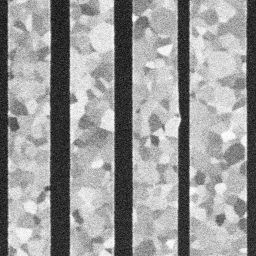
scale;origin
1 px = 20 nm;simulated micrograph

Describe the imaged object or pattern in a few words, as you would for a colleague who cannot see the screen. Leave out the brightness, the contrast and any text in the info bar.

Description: one or a few lines or trenches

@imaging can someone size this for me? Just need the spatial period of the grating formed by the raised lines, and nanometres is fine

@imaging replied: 1260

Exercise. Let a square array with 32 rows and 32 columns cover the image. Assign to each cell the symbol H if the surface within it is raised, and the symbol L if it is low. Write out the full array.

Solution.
LHHHHHLLLHHHHHLLLHHHHHLLHHHHHHHL
LHHHHHLLLHHHHHLLLHHHHHLLHHHHHHHL
LHHHHHLLLHHHHHLLLHHHHHLLHHHHHHHL
LHHHHHLLLHHHHHLLLHHHHHLLHHHHHHHL
LHHHHHLLLHHHHHLLLHHHHHLLHHHHHHHL
LHHHHHLLLHHHHHLLLHHHHHLLHHHHHHHL
LHHHHHLLLHHHHHLLLHHHHHLLHHHHHHHL
LHHHHHLLLHHHHHLLLHHHHHLLHHHHHHHL
LHHHHHLLLHHHHHLLLHHHHHLLHHHHHHHL
LHHHHHLLLHHHHHLLLHHHHHLLHHHHHHHL
LHHHHHLLLHHHHHLLLHHHHHLLHHHHHHHL
LHHHHHLLLHHHHHLLLHHHHHLLHHHHHHHL
LHHHHHLLLHHHHHLLLHHHHHLLHHHHHHHL
LHHHHHLLLHHHHHLLLHHHHHLLHHHHHHHL
LHHHHHLLLHHHHHLLLHHHHHLLHHHHHHHL
LHHHHHLLLHHHHHLLLHHHHHLLHHHHHHHL
LHHHHHLLLHHHHHLLLHHHHHLLHHHHHHHL
LHHHHHLLLHHHHHLLLHHHHHLLHHHHHHHL
LHHHHHLLLHHHHHLLLHHHHHLLHHHHHHHL
LHHHHHLLLHHHHHLLLHHHHHLLHHHHHHHL
LHHHHHLLLHHHHHLLLHHHHHLLHHHHHHHL
LHHHHHLLLHHHHHLLLHHHHHLLHHHHHHHL
LHHHHHLLLHHHHHLLLHHHHHLLHHHHHHHL
LHHHHHLLLHHHHHLLLHHHHHLLHHHHHHHL
LHHHHHLLLHHHHHLLLHHHHHLLHHHHHHHL
LHHHHHLLLHHHHHLLLHHHHHLLHHHHHHHL
LHHHHHLLLHHHHHLLLHHHHHLLHHHHHHHL
LHHHHHLLLHHHHHLLLHHHHHLLHHHHHHHL
LHHHHHLLLHHHHHLLLHHHHHLLHHHHHHHL
LHHHHHLLLHHHHHLLLHHHHHLLHHHHHHHL
LHHHHHLLLHHHHHLLLHHHHHLLHHHHHHHL
LHHHHHLLLHHHHHLLLHHHHHLLHHHHHHHL